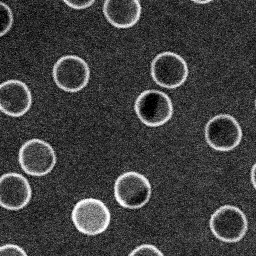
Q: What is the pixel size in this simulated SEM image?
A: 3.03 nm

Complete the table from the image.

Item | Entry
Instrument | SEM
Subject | a regular array of raised bodies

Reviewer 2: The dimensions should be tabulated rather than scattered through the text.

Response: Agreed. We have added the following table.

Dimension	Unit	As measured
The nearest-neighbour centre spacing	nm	186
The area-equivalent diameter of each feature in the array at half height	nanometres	104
